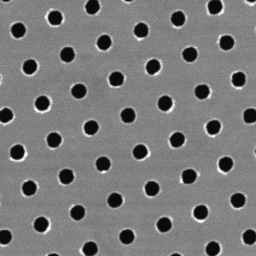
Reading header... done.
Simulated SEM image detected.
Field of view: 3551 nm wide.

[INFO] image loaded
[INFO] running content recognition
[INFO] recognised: a regular array of holes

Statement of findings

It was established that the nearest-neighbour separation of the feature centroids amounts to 0.53 microns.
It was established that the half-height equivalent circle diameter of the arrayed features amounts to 215 nm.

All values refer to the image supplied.